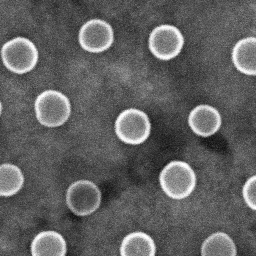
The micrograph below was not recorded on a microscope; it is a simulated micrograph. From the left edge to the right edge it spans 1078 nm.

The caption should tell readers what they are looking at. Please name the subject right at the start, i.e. a regular array of raised bodies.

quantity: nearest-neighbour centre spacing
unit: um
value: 0.283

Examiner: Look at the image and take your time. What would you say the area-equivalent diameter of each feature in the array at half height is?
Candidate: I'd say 144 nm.